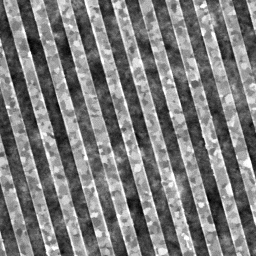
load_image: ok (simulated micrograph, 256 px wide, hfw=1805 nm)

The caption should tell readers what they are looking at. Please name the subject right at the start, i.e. parallel lines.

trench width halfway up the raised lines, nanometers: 95.1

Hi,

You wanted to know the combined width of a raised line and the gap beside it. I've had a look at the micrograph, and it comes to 0.184 micrometres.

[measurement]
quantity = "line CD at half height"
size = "89.2 nm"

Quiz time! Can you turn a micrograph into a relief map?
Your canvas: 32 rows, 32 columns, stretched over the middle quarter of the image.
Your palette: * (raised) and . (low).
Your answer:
...***....***...****...***....**
...***....***....***...****...**
...****...***....***....***....*
....***....***...****...***....*
....***....***....***...****...*
*...***....***....***....***...*
*....***....***...***....***....
*....***....***...****...***....
**...***....***....***...****...
**...****...***....***....***...
**....***....***...***....***...
**....***....***....***...****..
***...***....***....***....***..
***...****....***...***....***..
***....***....***...****...***..
****...***....***....***...****.
.***...****...***....***....***.
.***....***....***...***....***.
.***....***....***...****...***.
..***...***....***....***....***
..***...****...***....***....***
..***....***....***...****...***
..***....***....***....***...***
...***...****...***....***....**
...***....***....***...***....**
...***....***....***...****...**
...****...***....***....***...**
....***...****...***....***....*
....***....***....***...****...*
*...***....***....***...****...*
*...****...***....***....***....
*....***....***...****...***....